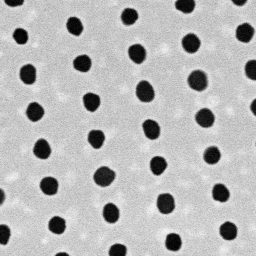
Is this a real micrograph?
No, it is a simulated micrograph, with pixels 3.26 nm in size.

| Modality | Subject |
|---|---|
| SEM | a regular array of holes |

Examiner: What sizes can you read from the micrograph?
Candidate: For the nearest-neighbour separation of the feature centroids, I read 124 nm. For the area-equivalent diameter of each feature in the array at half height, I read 59.3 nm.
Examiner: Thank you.